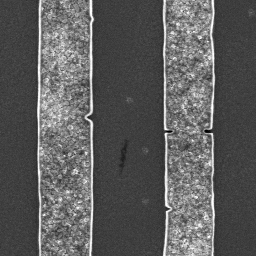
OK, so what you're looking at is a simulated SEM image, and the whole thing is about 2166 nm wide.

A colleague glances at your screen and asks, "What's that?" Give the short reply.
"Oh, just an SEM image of one or a few lines or trenches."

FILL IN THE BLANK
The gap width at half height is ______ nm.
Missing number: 621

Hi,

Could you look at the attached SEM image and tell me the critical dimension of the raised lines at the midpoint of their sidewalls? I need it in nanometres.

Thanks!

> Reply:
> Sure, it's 422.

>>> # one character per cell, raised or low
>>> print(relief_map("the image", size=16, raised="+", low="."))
..++++....+++...
..++++....+++...
..++++....+++...
..++++....+++...
..++++....+++...
..++++....+++...
..++++....+++...
..++++....+++...
..++++....+++...
..++++....+++...
..++++....+++...
..++++....+++...
..++++....+++...
...+++....+++...
..++++....+++...
..++++....+++...